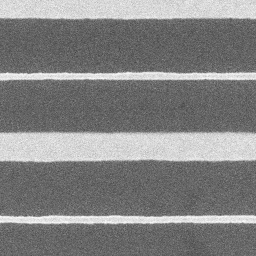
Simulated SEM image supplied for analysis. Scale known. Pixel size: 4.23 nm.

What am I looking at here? lines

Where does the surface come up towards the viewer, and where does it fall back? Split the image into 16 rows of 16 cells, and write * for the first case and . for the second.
****************
................
................
................
................
................
................
................
****************
****************
................
................
................
................
................
................